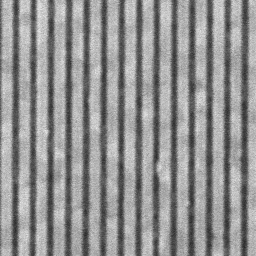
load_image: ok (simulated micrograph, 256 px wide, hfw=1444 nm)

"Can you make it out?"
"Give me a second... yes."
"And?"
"parallel lines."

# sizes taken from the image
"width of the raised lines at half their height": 52.8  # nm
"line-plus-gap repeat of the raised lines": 99.4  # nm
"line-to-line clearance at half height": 47.9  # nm